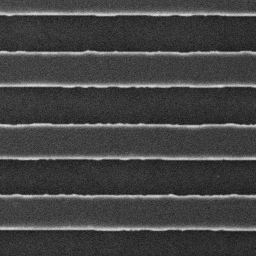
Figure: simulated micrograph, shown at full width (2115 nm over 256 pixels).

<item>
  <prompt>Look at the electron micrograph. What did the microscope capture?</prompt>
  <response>lines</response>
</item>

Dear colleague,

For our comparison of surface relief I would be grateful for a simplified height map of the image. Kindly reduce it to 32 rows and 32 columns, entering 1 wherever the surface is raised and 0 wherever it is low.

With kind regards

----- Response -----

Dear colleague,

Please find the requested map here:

11111111111111111111111111111111
11111111111111111111111111111111
00000000000000000000000000000000
00000000000000000000000000000000
00000000000000000000000000000000
00000000000000000000000000000000
10110000001100100001000010110011
11111111111111111111111111111111
11111111111111111111111111111111
11111111111111111111111111111111
11111111111111111111111111111111
00000000000000000000000000000000
00000000000000000000000000000000
00000000000000000000000000000000
00000000000000000000000000000000
00000000000000000000000000000000
11111111111111111111111111111111
11111111111111111111111111111111
11111111111111111111111111111111
11111111111111111111111111111111
00000000000000000000000000000000
00000000000000000000000000000000
00000000000000000000000000000000
00000000000000000000000000000000
11111111111111111111110111111111
11111111111111111111111111111111
11111111111111111111111111111111
11111111111111111111111111111111
11111111111111111111111111111111
00000000000000000000000000000000
00000000000000000000000000000000
00000000000000000000000000000000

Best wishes